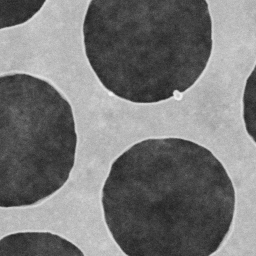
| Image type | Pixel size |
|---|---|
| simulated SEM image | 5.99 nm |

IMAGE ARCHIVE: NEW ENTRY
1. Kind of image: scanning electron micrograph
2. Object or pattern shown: holes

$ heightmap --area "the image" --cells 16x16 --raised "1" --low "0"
0001100000000111
0111100000000111
1111100000000111
1111100000000111
1111110000000111
0001111000001110
0000111111111110
0000011111111110
0000011111111111
0000011100000111
0000111000000011
0000111000000001
0001110000000001
1111111000000001
1111111000000011
0000011100000011